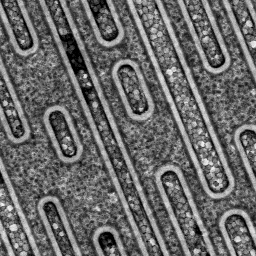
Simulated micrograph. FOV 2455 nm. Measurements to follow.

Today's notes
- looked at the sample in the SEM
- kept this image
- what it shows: parallel lines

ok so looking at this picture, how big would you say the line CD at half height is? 183 nm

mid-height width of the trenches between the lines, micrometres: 0.211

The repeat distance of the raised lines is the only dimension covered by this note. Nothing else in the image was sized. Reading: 397 nm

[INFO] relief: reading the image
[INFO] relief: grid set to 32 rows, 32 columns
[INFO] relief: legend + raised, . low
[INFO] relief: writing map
...++...+++...++....+++...++...+
...+++..+++...+++...+++...+++...
+...++...++....++....++....++...
+...+++..+++...++....+++...++...
+...+++...++...+++....++...+++..
++...++...+++.++++....+++...++..
+++.++++..+++++++++...+++...+++.
++++++++...++++++++....++...+++.
+++++++++..+++...+++...+++..++++
.++++++++...++...+++....++++++++
.++++++++...+++...++....++++++++
..++++++++...++...+++....+++++++
..++++++++...++....++....+++++++
..+++++++++..+++...+++...+++++++
...+++..+++...+++.++++....++++++
+..+++...++...++++++++....++++++
+..+++...+++...++++++++....+++..
++.++++...++...++++++++....+++..
+++++++...+++..+++++++++...+++..
++++++++..+++...++++++++....++..
+++++++++++++...++++++++....+++.
++++++++++++++...+++..+++....++.
.+++++++++++++...+++...++....+++
.++++++++++++++..+++...+++...+++
..+++++++++++++...++....++++++++
..+++..+++++++++..+++...++++++++
...++...++++++++...++...+++++.++
...++...++++++++...+++...+++...+
...+++...++++++++..+++...+++...+
....++...+++...++...++....++....
+...+++..+++...+++..+++...+++...
+....++...++...+++...++....++...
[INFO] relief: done